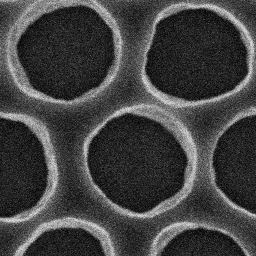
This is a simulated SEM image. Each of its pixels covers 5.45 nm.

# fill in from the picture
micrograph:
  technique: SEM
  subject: holes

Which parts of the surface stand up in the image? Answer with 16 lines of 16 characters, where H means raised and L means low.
HHHLLLHHHHHHLHHH
HHLLLLLHHHLLLLLH
HLLLLLLHHLLLLLLH
HLLLLLLHHLLLLLLL
HLLLLLLHHLLLLLLL
HHLLLLHHHHLLLLLH
HHHHHHHHHHHHHHHH
LHHHHHHLLLHHHHHL
LLHHHHLLLLLHHHLL
LLLHHLLLLLLLHLLL
LLLHHLLLLLLLHLLL
LLLHHHLLLLLLHLLL
LLLHHHHLLLHHHHLL
LHHHHHHHHHHHHHHH
HHHLLLHHHHHLLLHH
HHLLLLHHHHLLLLLH